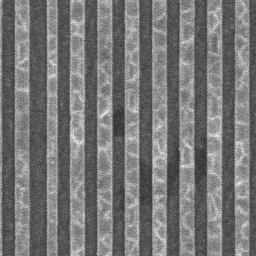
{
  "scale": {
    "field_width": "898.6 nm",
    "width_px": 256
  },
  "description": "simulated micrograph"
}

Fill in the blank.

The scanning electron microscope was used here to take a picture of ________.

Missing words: parallel lines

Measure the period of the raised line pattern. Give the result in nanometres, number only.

96.6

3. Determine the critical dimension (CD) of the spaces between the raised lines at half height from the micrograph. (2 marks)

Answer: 49.6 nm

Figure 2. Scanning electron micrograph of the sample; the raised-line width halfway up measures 47 nanometers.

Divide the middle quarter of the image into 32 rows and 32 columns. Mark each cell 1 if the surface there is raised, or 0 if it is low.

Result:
00111000011100001110001110000111
00111000011100001110001110000111
00111000111100001110001110000111
00111000111100001110001110000111
00111000111100001110001110000111
00111000111100001110001110000111
00111000111100001100001110000111
00111000111100001110001110000111
00111000111100001100001110000111
00111000111100001100001110000111
00111000111100011110001110000111
00111000111100001110001110000111
00111000111100001100001110000111
00111000111100001100001110000111
00111000111100001100001110000111
00111000111100001100001110000111
00111000111100001100001110000111
00111000111100011100001110000111
00111000111100001100001110000111
00111000111100001100001110000111
00111000111100011110001110000111
00111000101100011110001110000111
00111000111100011110001110000111
00111000111100001110001110000111
00111000111100001110001110000111
00111000111100001110001110000111
00111000111100011110001110000111
00111000111100011100001110000111
00111000111100011100001110000111
00111000111100011100001110000111
00111000111100011100001110000111
00111000111100011100001110000111